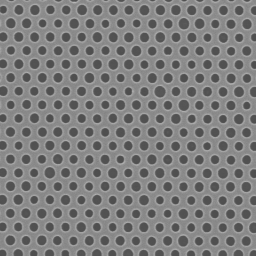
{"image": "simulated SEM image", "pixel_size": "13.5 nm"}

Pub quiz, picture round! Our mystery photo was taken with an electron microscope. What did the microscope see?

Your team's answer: a regular array of holes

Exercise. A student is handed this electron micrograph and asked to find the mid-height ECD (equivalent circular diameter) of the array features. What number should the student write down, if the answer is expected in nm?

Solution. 122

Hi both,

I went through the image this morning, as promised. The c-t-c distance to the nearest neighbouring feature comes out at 208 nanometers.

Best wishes